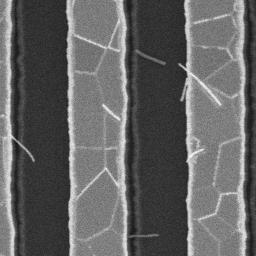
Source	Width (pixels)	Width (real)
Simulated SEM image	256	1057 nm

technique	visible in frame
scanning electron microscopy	lines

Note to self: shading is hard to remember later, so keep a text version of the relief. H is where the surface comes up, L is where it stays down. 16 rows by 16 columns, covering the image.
HLLLHHHHLLLLHHHL
HLLLHHHHLLLLHHHL
HLLLHHHHLLLLHHHL
HLLLHHHHLLLLHHHL
HLLLHHHHLLLLHHHL
HLLLHHHHLLLLHHHL
HLLLHHHHLLLLHHHL
HLLLHHHHLLLLHHHL
HLLLHHHHLLLLHHHL
HLLLHHHHLLLLHHHL
HLLLHHHHLLLLHHHL
HLLLHHHHLLLLHHHL
HLLLHHHHLLLLHHHL
HLLLHHHHLLLLHHHL
HLLLHHHHLLLLHHHL
HLLLHHHHLLLLHHHL